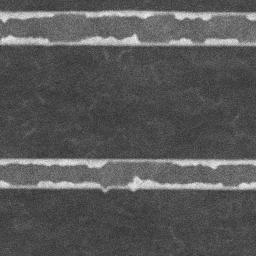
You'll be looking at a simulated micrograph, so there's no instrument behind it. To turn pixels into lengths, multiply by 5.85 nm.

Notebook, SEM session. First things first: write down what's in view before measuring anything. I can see one or a few lines or trenches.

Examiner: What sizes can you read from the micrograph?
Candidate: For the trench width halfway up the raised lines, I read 673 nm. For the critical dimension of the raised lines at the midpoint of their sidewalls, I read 0.178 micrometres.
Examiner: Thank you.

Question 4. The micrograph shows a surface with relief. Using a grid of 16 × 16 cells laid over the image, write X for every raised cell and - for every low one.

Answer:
----------------
XXXXXXXXXXXXXXXX
XXXXXXXXXXXXXXXX
----------------
----------------
----------------
----------------
----------------
----------------
----------------
XXXXXXXXXXXXXXXX
XXXXXXXXXXXXXXXX
----------------
----------------
----------------
----------------